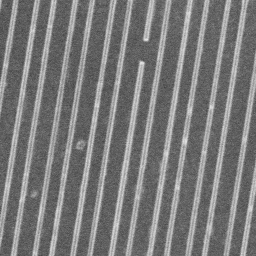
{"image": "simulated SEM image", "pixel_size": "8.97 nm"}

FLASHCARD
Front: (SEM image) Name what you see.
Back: parallel lines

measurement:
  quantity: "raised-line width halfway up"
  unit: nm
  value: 34.3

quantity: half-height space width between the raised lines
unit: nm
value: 121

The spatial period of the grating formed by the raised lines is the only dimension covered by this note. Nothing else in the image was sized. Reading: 18.9 pixels